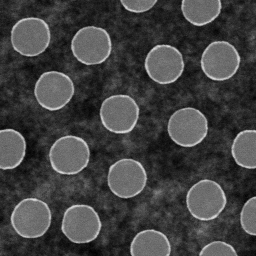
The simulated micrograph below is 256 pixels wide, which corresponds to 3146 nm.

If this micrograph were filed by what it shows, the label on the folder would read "a regular array of raised bodies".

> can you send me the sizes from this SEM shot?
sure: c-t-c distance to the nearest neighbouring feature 718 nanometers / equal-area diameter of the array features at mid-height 472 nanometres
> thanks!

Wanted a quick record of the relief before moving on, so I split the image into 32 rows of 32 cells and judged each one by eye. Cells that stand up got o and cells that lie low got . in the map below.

...............oooo....ooooo....
.......................oooo.....
...oo..................oooo.....
..oooo.....o....................
.ooooo...ooooo..................
..oooo...ooooo............ooo...
..ooo....ooooo.....ooo....oooo..
..........ooo.....ooooo..ooooo..
..................ooooo..ooooo..
.....ooo...........ooo....ooo...
.....oooo.......................
....ooooo.......................
.....oooo....oooo...............
......o......oooo......o........
.............oooo....oooo.......
.............oooo....ooooo......
oo............oo.....ooooo....oo
ooo....ooo............ooo....ooo
ooo...ooooo..................ooo
ooo...ooooo..................ooo
oo....ooooo...ooo.............oo
.......ooo....oooo..............
..............oooo..............
..............oooo......oooo....
...............oo......ooooo....
..oooo.................ooooo...o
..oooo..oooo............ooo...oo
..oooo..oooo..................oo
..oooo..oooo..................oo
...oo...oooo.....ooo............
................ooooo.....oo....
................ooooo....oooo...